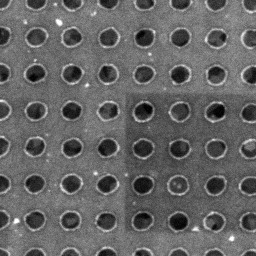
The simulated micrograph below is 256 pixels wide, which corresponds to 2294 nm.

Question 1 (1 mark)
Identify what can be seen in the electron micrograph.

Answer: a regular array of raised bodies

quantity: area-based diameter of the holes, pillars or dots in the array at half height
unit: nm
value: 177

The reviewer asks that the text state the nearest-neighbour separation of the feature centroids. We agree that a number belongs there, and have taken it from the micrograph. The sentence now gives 320 nanometres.